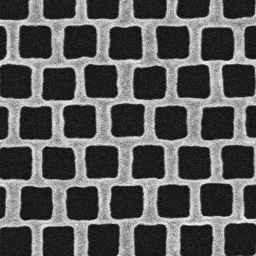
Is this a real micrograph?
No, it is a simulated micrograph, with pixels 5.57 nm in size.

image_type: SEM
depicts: a regular array of holes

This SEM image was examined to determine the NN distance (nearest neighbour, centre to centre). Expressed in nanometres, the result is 242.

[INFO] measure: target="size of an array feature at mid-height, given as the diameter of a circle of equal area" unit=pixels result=36.3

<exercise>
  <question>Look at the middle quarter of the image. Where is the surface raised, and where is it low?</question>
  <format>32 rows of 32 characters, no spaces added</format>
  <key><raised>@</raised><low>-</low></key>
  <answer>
@@@@@@-------@@@@@@@@@@-@@@@@@@-
---@@--------@@@@@--------@@----
---@@--------@@@@---------@@----
---@@--------@@@@---------@@----
---@@--------@@@@---------@@----
---@@--------@@@@---------@@----
---@@--------@@@@---------@@----
---@@--------@@@@--------@@@----
--@@@@@-@---@@@@@@-------@@@@---
@@@@@@@@@@@@@@@@@@@@@@@@@@@@@@@@
@------@@@@@--------@@@@@@---@@@
--------@@@@--------@@@--------@
--------@@@@--------@@@--------@
--------@@@@--------@@@--------@
--------@@@@--------@@@--------@
--------@@@@--------@@@--------@
--------@@@@--------@@@--------@
--------@@@@--------@@@--------@
@------@@@@@@@@@@@@@@@@@------@@
@@@@@@@@@@@@@@@@@@@@@@@@@@@@@@@@
@@@@@@------@@@@@@------@@@@@@@@
--@@@--------@@@@--------@@@----
---@@---------@@@--------@@@----
---@@---------@@@--------@@@@---
---@@---------@@@--------@@@@---
---@@---------@@@--------@@@@---
---@@@--------@@@--------@@@@---
---@@@--------@@@--------@@@@---
--@@@@-------@@@@--------@@@@---
@@@@@@@@@@@@@@@@@@@@@@@@@@@@@@@@
@@@@@@@-@@@@-------@@@@@-------@
@-------@@@@--------@@@--------@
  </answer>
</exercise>